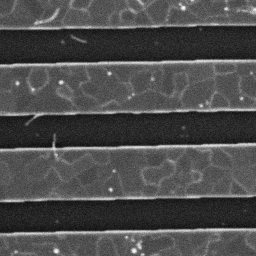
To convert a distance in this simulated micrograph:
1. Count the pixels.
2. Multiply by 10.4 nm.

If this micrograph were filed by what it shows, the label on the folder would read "lines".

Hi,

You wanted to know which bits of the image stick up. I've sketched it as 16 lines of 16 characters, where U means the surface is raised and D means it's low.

UUUUUUUUUUUUUUUU
UUUUUUUUUUUUUUUU
DDDDDDDDDDDDDDDD
DDDDDDDDDDDDDDDD
UUUUUUUUUUUUUUUU
UUUUUUUUUUUUUUUU
UUUUUUUUUUUUUUUU
DDDDDDDDDDDDDDDD
DDDDDDDDDDDDDDDD
UUUUUUUUUUUUUUUU
UUUUUUUUUUUUUUUU
UUUUUUUUUUUUUUUU
UUUDDDDDDDDDDDDD
DDDDDDDDDDDDDDDD
DDDDDDUUUUUUUUUU
UUUUUUUUUUUUUUUU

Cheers